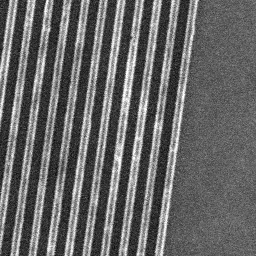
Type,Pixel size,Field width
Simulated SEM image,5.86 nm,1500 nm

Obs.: parallel lines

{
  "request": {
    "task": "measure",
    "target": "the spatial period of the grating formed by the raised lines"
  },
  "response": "105 nanometers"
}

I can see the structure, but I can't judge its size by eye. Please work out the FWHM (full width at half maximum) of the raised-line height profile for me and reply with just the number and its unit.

38.4 nm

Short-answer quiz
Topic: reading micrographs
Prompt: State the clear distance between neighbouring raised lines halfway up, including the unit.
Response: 0.0661 microns